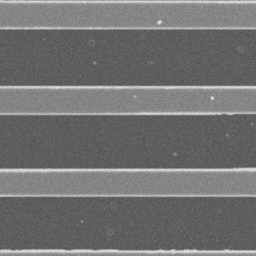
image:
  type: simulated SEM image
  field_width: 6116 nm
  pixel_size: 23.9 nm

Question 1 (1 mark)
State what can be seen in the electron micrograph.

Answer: lines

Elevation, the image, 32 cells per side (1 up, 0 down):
11111111111111111111111111111111
11111111111111111111111111111111
11111111111111111111111111111111
11111111111111111111111111111111
00000000000000000000000000000000
00000000000000000000000000000000
00000000000000000000000000000000
00000000000000000000000000000000
00000000000000000000000000000000
00000000000000000000000000000000
00000000000000000000000000000000
11111111111111111111111111111111
11111111111111111111111111111111
11111111111111111111111111111111
00000000000000000000000000000000
00000000000000000000000000000000
00000000000000000000000000000000
00000000000000000000000000000000
00000000000000000000000000000000
00000000000000000000000000000000
00000000000000000000000000000000
11111111111111111111111111111111
11111111111111111111111111111111
11111111111111111111111111111111
00000000000000000000000000000000
00000000000000000000000000000000
00000000000000000000000000000000
00000000000000000000000000000000
00000000000000000000000000000000
00000000000000000000000000000000
00000000000000000000000000000000
11111111111111111111111111111111